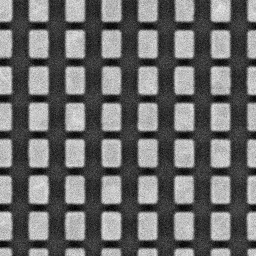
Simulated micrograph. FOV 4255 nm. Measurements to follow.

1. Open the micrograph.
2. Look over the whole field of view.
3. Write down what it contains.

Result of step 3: wiring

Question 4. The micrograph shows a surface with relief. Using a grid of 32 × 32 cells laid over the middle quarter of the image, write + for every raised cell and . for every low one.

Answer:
................................
.++++.....++++.....++++.....++++
.++++.....++++.....++++.....++++
.++++.....++++.....++++.....++++
.++++.....++++.....++++.....++++
.++++.....++++.....++++.....++++
.++++.....++++.....++++.....++++
................................
................................
................................
.++++.....++++.....++++.....++++
.++++.....++++.....++++.....++++
.++++.....++++.....++++.....++++
.++++.....++++.....++++.....++++
.++++.....++++.....++++.....++++
.++++.....++++.....++++.....++++
.++++.....++++.....++++.....++++
................................
................................
.++++.....++++.....++++.....++++
.++++.....++++.....++++.....++++
.++++.....++++.....++++.....++++
.++++.....++++.....++++.....++++
.++++.....++++.....++++.....++++
.++++.....++++.....++++.....++++
.++..................++.....++++
................................
................................
.++++.....++++.....++++.....++++
.++++.....++++.....++++.....++++
.++++.....++++.....++++.....++++
.++++.....++++.....++++.....++++